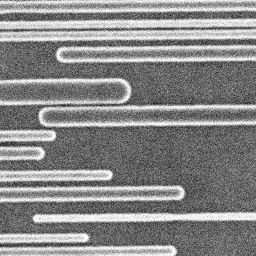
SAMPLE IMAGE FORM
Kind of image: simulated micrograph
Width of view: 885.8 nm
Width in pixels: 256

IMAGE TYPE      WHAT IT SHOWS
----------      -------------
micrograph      groups of lines, slits or small figures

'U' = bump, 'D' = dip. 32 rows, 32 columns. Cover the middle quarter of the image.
DDDDDDDDDDDDDDDDDDDDDDDDDDDDDDDD
DDDDDDDDDDDDDDDDDDDDDDDDDDDDDDDD
DDDDDDDDDDDDDDDDDDDDDDDDDDDDDDDD
DDDDDDDDDDDDDDDDDDDDDDDDDDDDDDDD
UUUUUUUUUUUUUUUDDDDDDDDDDDDDDDDD
UUUUUUUUUUUUUUUUDDDDDDDDDDDDDDDD
UUUUUUUUUUUUUUUUDDDDDDDDDDDDDDDD
UUUUUUUUUUUUUUUUDDDDDDDDDDDDDDDD
UUUUUUUUUUUUUUUUDDDDDDDDDDDDDDDD
UUUUUUUUUUUUUUUDDDDDDDDDDDDDDDDD
DDDDDDDDDDDDDDDDDDDDDDDDDDDDDDDD
UUUUUUUUUUUUUUUUUUUUUUUUUUUUUUUU
UUUUUUUUUUUUUUUUUUUUUUUUUUUUUUUU
UUUUUUUUUUUUUUUUUUUUUUUUUUUUUUUU
UUUUUUUUUUUUUUUUUUUUUUUUUUUUUUUU
DDDDDDDDDDDDDDDDDDDDDDDDDDDDDDDD
DDDDDDDDDDDDDDDDDDDDDDDDDDDDDDDD
DDDDDDDDDDDDDDDDDDDDDDDDDDDDDDDD
DDDDDDDDDDDDDDDDDDDDDDDDDDDDDDDD
DDDDDDDDDDDDDDDDDDDDDDDDDDDDDDDD
DDDDDDDDDDDDDDDDDDDDDDDDDDDDDDDD
DDDDDDDDDDDDDDDDDDDDDDDDDDDDDDDD
DDDDDDDDDDDDDDDDDDDDDDDDDDDDDDDD
DDDDDDDDDDDDDDDDDDDDDDDDDDDDDDDD
DDDDDDDDDDDDDDDDDDDDDDDDDDDDDDDD
DDDDDDDDDDDDDDDDDDDDDDDDDDDDDDDD
DDDDDDDDDDDDDDDDDDDDDDDDDDDDDDDD
UUUUUUUUUUUUDDDDDDDDDDDDDDDDDDDD
UUUUUUUUUUUUDDDDDDDDDDDDDDDDDDDD
DDDDDDDDDDDDDDDDDDDDDDDDDDDDDDDD
DDDDDDDDDDDDDDDDDDDDDDDDDDDDDDDD
UUUUUUUUUUUUUUUUUUUUUUUUUUUUUUDD